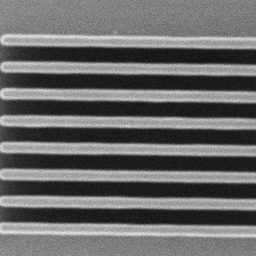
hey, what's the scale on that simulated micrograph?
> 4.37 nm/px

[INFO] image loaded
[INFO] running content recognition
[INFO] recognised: groups of lines, slits or small figures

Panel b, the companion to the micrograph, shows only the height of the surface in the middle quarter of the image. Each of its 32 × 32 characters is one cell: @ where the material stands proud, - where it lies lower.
@@@@@@@@@@@@@@@@@@@@@@@@@@@@@@@@
@@@@@@@@@@@@@@@@@@@@@@@@@@@@@@@@
------------------------@@@@@@@@
--------------------------------
--------------------------------
--------------------------------
----@@--------------------------
@@@@@@@@@@@@@@@@@@@@@@@@@@@@@@@@
@@@@@@@@@@@@@@@@@@@@@@@@@@@@@@@@
--------------------------------
--------------------------------
--------------------------------
--------------------------------
@@@@@@@@@@@@@@@@@@@-------------
@@@@@@@@@@@@@@@@@@@@@@@@@@@@@@@@
@@@@@@@@@@@@@@@@@@@@@@@@@@@@@@@@
--------------------------------
--------------------------------
--------------------------------
--------------------------------
@@@@@@@@@@@@@@@@@@@@@@@@@@@@@@@@
@@@@@@@@@@@@@@@@@@@@@@@@@@@@@@@@
----------------@@@@@@@@@@@@@@@@
--------------------------------
--------------------------------
--------------------------------
--------------------------------
@@@@@@@@@@@@@@@@@@@@@@@@@@@@@@@@
@@@@@@@@@@@@@@@@@@@@@@@@@@@@@@@@
--------------------------------
--------------------------------
--------------------------------